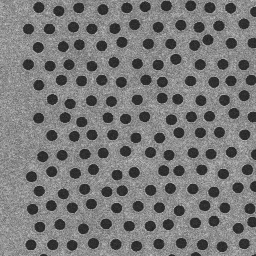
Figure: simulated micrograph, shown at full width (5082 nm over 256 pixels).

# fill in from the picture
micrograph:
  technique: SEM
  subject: a regular array of holes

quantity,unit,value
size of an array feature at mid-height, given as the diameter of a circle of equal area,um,0.218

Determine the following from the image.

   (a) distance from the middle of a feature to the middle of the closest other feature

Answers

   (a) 359 nanometres